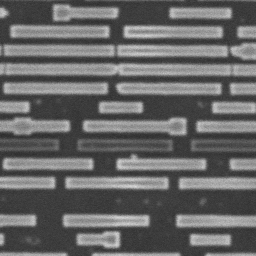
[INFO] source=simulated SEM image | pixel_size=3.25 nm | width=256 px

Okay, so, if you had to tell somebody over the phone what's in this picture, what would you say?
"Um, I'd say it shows wiring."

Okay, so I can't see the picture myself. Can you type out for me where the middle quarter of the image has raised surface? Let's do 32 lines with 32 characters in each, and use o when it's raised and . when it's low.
ooooooooooooo.oooooooooooooooooo
oooooooooooooooooooooooooooooooo
ooooooooooooo.oooooooooooooooooo
................................
................................
ooooooooooo..ooooooooooooooooooo
ooooooooooo..ooooooooooooooooooo
................................
................................
................................
.........oooooooooo.............
.........oooooooooo.............
................................
................................
o....oooooo..oo...........oooo..
o....ooooooooooooooooooooooooo..
o....ooooooooooooooooooooooooo..
..........................oooo..
................................
....ooooooooooooooooooooooo.....
....ooooooooooooooooooooooo.....
....oooooooooo......ooooooo.....
................................
................................
ooooooo......ooooooooooooooooooo
ooooooo......oo.oooooooooooooooo
................................
................................
................................
.ooooooooooooo......oooooo...ooo
.ooooooooooooooooooooooooo...ooo
................................